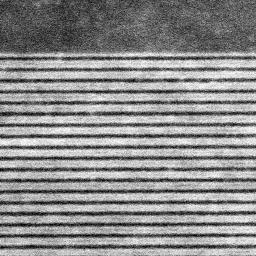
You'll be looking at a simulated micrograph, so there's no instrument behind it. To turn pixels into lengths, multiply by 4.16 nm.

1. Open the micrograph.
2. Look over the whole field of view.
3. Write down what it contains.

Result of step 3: parallel lines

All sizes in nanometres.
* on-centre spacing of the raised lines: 46.1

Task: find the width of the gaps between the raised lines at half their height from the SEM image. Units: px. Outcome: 4.5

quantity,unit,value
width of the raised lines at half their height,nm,26.5